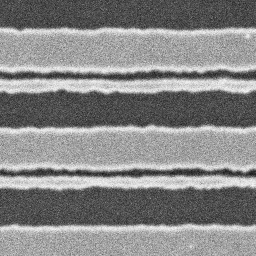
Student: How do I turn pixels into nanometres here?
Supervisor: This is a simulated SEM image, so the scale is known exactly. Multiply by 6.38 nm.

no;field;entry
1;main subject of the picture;lines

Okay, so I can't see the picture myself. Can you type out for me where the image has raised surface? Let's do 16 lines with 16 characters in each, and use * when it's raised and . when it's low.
................
................
****************
****************
****************
****************
................
................
****************
****************
****************
****************
................
................
****************
****************